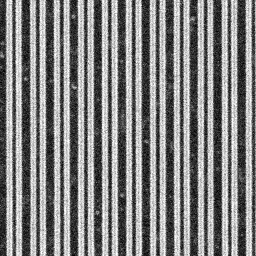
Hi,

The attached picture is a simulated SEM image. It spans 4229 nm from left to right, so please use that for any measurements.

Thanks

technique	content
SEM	parallel lines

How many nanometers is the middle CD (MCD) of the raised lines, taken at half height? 70.2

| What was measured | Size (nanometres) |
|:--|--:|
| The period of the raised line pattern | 198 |